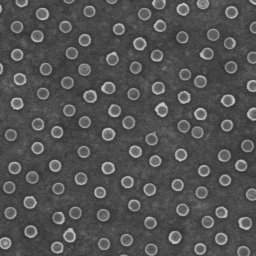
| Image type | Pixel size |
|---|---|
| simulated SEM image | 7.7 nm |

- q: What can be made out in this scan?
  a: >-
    a regular array of raised bodies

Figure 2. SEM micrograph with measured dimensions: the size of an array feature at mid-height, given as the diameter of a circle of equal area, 89.9 nanometres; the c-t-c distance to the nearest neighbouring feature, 171 nanometres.